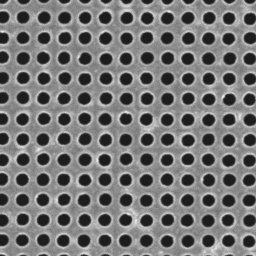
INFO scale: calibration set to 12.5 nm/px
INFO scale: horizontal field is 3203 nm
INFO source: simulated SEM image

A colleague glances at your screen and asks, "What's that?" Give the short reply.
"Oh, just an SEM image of a regular array of holes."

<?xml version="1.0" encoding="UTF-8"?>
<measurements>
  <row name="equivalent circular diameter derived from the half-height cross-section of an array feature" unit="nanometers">161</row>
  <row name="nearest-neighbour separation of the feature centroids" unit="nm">250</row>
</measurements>